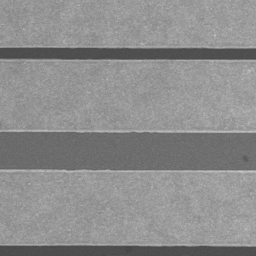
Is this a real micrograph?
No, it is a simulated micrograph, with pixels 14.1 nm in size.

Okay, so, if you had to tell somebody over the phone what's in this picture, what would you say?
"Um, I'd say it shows lines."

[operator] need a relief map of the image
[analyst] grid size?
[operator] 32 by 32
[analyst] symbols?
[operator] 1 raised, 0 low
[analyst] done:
11111111111111111111111111111111
11111111111111111111111111111111
11111111111111111111111111111111
11111111111111111111111111111111
11111111111111111111111111111111
11111111111111111111111111111111
00000000000000000000000000000000
11111110000000000000000000000000
11111111111111111111111111111111
11111111111111111111111111111111
11111111111111111111111111111111
11111111111111111111111111111111
11111111111111111111111111111111
11111111111111111111111111111111
11111111111111111111111111111111
11111111111111111111111111111111
00000000011001111001111111111111
00000000000000000000000000000000
00000000000000000000000000000000
00000000000000000000000000000000
00000000000000000000000000000000
11111111111111111111111111111111
11111111111111111111111111111111
11111111111111111111111111111111
11111111111111111111111111111111
11111111111111111111111111111111
11111111111111111111111111111111
11111111111111111111111111111111
11111111111111111111111111111111
11111111111111111111111111111111
11111111111111111111111111111111
00000000000000000000000000000000